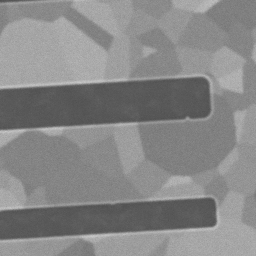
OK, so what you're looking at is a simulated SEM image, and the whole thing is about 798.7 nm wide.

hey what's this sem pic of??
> one or a few lines or trenches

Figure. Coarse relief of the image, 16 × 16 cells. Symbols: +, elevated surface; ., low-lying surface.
++++++++++++++++
++++++++++++++++
++++++++++++++++
++++++++++++++++
++++++++++++++++
.............+++
.............+++
...........+++++
++++++++++++++++
++++++++++++++++
++++++++++++++++
++++++++++++++++
++++++++++...+++
..............++
.........+++++++
++++++++++++++++